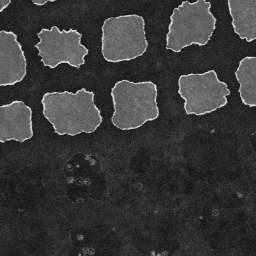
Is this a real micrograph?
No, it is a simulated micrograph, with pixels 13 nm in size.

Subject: raised bodies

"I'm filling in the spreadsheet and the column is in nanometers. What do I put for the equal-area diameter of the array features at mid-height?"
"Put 617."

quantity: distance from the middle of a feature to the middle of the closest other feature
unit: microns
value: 0.822